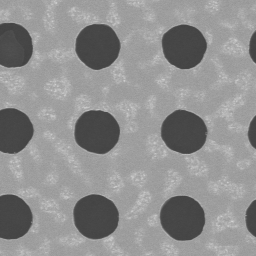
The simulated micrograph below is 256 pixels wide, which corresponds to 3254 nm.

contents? holes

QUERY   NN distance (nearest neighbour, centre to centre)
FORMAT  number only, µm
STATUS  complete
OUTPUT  1.09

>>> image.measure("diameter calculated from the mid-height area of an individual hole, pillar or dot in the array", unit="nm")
572